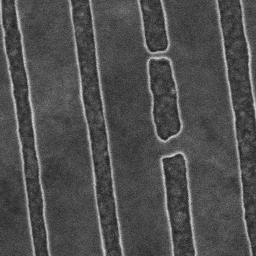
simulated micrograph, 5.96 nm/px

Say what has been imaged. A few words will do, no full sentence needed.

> one or a few lines or trenches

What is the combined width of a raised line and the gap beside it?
432 nm